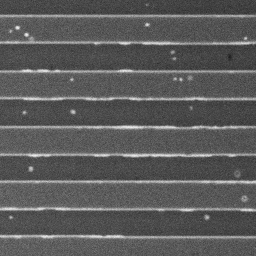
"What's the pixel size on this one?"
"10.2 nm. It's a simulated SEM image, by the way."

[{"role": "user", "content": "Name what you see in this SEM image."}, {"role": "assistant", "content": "lines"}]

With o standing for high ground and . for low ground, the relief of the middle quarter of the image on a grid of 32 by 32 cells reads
................................
................................
oooooooooooooooooooooooooooooooo
oooooooooooooooooooooooooooooooo
oooooooooooooooooooooooooooooooo
oooooooooooooooooooooooooooooooo
oooooooooooooooooooooooooooooooo
oooooooooooooooooooooooooooooooo
oooooooooooooooooooooooooooooooo
................................
................................
................................
................................
................................
................................
................................
oooooooooooooooooooooooooooooooo
oooooooooooooooooooooooooooooooo
oooooooooooooooooooooooooooooooo
oooooooooooooooooooooooooooooooo
oooooooooooooooooooooooooooooooo
oooooooooooooooooooooooooooooooo
oooooooooooooooooooooooooooooooo
................................
................................
................................
................................
................................
................................
oooooooooooooooooooooooooooooooo
oooooooooooooooooooooooooooooooo
oooooooooooooooooooooooooooooooo